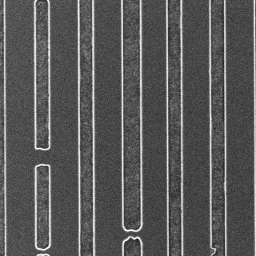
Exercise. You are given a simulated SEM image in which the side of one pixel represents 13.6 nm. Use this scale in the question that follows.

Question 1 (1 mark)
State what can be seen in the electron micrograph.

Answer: parallel lines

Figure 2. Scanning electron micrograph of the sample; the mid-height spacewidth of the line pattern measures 14.1 pixels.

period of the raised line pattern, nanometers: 597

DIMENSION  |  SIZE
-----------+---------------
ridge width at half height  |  30 pixels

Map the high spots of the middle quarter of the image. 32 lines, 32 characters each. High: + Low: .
++++...++++++++....+++++++...+++
++++...++++++++....+++++++...+++
++++...++++++++....+++++++...+++
++++...++++++++....+++++++...+++
++++...++++++++....+++++++...+++
++++...++++++++....+++++++...+++
++++...++++++++....+++++++...+++
++++...++++++++....+++++++...+++
++++...++++++++....+++++++...+++
++++...++++++++....+++++++...+++
++++...++++++++....+++++++...+++
++++...++++++++....+++++++...+++
++++...++++++++....+++++++...+++
++++...++++++++....+++++++...+++
++++...++++++++....+++++++...+++
++++...++++++++....+++++++...+++
++++...++++++++....+++++++...+++
++++...++++++++....+++++++...+++
++++...++++++++....+++++++...+++
++++...++++++++....+++++++...+++
++++...++++++++....+++++++...+++
++++...++++++++....+++++++....++
++++...++++++++....+++++++....++
++++...++++++++....+++++++....++
++++...++++++++....+++++++....++
++++...++++++++....+++++++....++
++++...++++++++....+++++++....++
++++...++++++++....+++++++....++
++++...++++++++....+++++++....++
++++...++++++++....+++++++....++
++++...++++++++....+++++++....++
++++...++++++++....+++++++....++